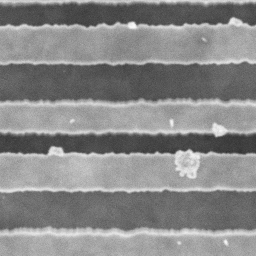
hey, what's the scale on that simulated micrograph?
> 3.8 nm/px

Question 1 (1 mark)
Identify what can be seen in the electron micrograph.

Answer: lines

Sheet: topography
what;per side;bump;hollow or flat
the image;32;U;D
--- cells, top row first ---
DDDDDDDDDDDDDDDDDDDDDDDDDDDDDDDD
DDDDDDDDDDDDDDDDDDDDDDDDDDDDDDDD
DDDDDDDDDDDDDDDDDDDDDDDDDDDDDUDD
UUUUUUUUUUUUUUUUUUUUUUUUUUUUUUUU
UUUUUUUUUUUUUUUUUUUUUUUUUUUUUUUU
UUUUUUUUUUUUUUUUUUUUUUUUUUUUUUUU
UUUUUUUUUUUUUUUUUUUUUUUUUUUUUUUU
UUUUUUUUUUUUUUUUUUUUUUUUUUUUUUUU
DDDDDDDDDDDDDDDDDDDDDDDDDDDDDDDD
DDDDDDDDDDDDDDDDDDDDDDDDDDDDDDDD
DDDDDDDDDDDDDDDDDDDDDDDDDDDDDDDD
DDDDDDDDDDDDDDDDDDDDDDDDDDDDDDDD
DDDDDDDDDDDDDDDDDDDDDDDDDDDDDDDD
UUUUUUUUUUUUUUUUUUUUUUUUUUUUUUUU
UUUUUUUUUUUUUUUUUUUUUUUUUUUUUUUU
UUUUUUUUUUUUUUUUUUUUUUUUUUUUUUUU
UUUUUUUUUUUUUUUUUUUUUUUUUUUUUUUU
DDDDDDDDDDDDDDDDDDDDDDDDDDDDDDDD
DDDDDDDDDDDDDDDDDDDDDDDDDDDDDDDD
UUUUUUUUUUUUUUUUUUUUUUUUUUUUUUUU
UUUUUUUUUUUUUUUUUUUUUUUUUUUUUUUU
UUUUUUUUUUUUUUUUUUUUUUUUUUUUUUUU
UUUUUUUUUUUUUUUUUUUUUUUUUUUUUUUU
UUUUUUUUUUUUUUUUUUUUUUUUUUUUUUUU
DDDDDDDDDDDDDDDDDDDDDDDDDDDDDDDD
DDDDDDDDDDDDDDDDDDDDDDDDDDDDDDDD
DDDDDDDDDDDDDDDDDDDDDDDDDDDDDDDD
DDDDDDDDDDDDDDDDDDDDDDDDDDDDDDDD
DDDDDDDDDDDDDDDDDDDDDDDDDDDDDDDD
UUUUUUUUUUUUUUUUUUUUUUUUUUUUUUUU
UUUUUUUUUUUUUUUUUUUUUUUUUUUUUUUU
UUUUUUUUUUUUUUUUUUUUUUUUUUUUUUUU